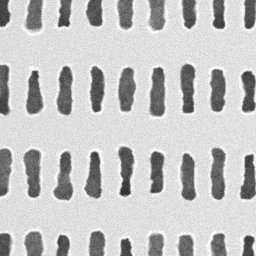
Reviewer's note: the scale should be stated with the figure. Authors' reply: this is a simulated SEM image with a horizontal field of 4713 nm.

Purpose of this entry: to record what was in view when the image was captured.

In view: a regular array of holes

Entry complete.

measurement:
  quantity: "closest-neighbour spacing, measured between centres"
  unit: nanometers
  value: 552